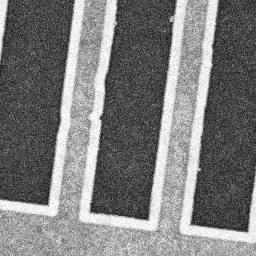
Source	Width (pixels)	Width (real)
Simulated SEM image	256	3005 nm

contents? one or a few lines or trenches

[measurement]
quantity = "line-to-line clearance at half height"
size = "68.1 pixels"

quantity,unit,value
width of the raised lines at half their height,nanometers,384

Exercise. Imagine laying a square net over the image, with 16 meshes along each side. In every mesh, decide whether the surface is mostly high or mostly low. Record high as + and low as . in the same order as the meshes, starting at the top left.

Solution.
.....++....++...
.....++....++...
.....++....++...
.....++....++...
....++.....++...
....++.....++...
....++.....++...
....++....++....
....++....++....
....++....++....
....++....++....
....++....++....
...++.....++....
++++++....++....
+++++++++++++...
++++++++++++++++